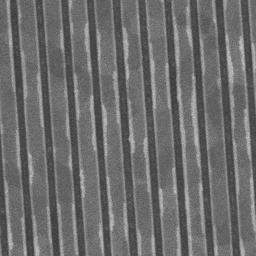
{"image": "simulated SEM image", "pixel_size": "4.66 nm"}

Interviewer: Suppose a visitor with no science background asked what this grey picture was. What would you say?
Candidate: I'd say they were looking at parallel lines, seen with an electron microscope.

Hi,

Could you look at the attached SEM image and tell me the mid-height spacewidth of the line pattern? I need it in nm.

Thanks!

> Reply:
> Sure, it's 38.9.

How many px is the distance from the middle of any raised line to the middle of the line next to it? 25.7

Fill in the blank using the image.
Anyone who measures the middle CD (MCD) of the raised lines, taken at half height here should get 82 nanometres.